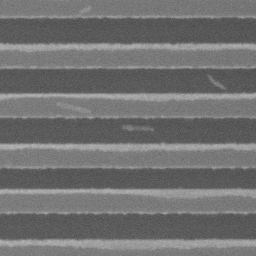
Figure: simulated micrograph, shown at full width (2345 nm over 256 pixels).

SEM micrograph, lines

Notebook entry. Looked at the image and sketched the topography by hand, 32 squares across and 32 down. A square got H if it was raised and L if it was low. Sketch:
HHHHHHHHHHHHHHHHHHHHHHHHHHHHHHHH
HHHHHHHHHHHHHHHHHHHHHHHHHHHHHHHH
LLLLLLLLLLLLLLLLLLLLLLLLLLLLLLLL
LLLLLLLLLLLLLLLLLLLLLLLLLLLLLLLL
LLLLLLLLLLLLLLLLLLLLLLLLLLLLLLLL
LLLLLLLLLLLLLLLLLLLLLLLLLLLLLLLL
HHHHHHHHHHHHHHHHHHHHHHHHHHHHHHHH
HHHHHHHHHHHHHHHHHHHHHHHHHHHHHHHH
LLLLLLLLLLLLLLLLLLLLLLLLLLLLLLLL
LLLLLLLLLLLLLLLLLLLLLLLLLLLLLLLL
LLLLLLLLLLLLLLLLLLLLLLLLLLLLLLLL
LLLLLLLLLLLLLLLLLLLLLLLLLLLLLLLL
HHHHHHHHHHHHHHHHHHHHHHHHHHHHHHHH
HHHHHHHHHHHHHHHHHHHHHHHHHHHHHHHH
HHHHHHHHHHHHHHHHHHHHHHHHHHHHHHHH
LLLLLLLLLLLLLLLLLLLLLLLLLLLLLLLL
LLLLLLLLLLLLLLLLLLLLLLLLLLLLLLLL
LLLLLLLLLLLLLLLLLLLLLLLLLLLLLLLL
HHHHHHHHHHHHHHHHHHHHHHHHHHHHHHHH
HHHHHHHHHHHHHHHHHHHHHHHHHHHHHHHH
HHHHHHHHHHHHHHHHHHHHHHHHHHHHHHHH
LLLLLLLLLLLLLLLLLLLLLLLLLLLLLLLL
LLLLLLLLLLLLLLLLLLLLLLLLLLLLLLLL
LLLLLLLLLLLLLLLLLLLLLLLLLLLLLLLL
HHHHHHHHHHHHHHHHHHHHHHHHHHHHHHHH
HHHHHHHHHHHHHHHHHHHHHHHHHHHHHHHH
HHHHHHHHHHHHHHHHHHHHHHHHHHHHHHHH
LLLLLLLLLLLLLLLLLLLLLLLLLLLLLLLL
LLLLLLLLLLLLLLLLLLLLLLLLLLLLLLLL
LLLLLLLLLLLLLLLLLLLLLLLLLLLLLLLL
HHHHHHHHHHHHHHHHLLHHHHHHHHHHHHHH
HHHHHHHHHHHHHHHHHHHHHHHHHHHHHHHH